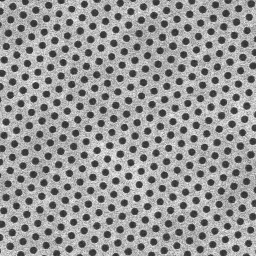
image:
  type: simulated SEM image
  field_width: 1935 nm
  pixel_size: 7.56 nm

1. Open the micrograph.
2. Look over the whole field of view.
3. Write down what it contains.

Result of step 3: a regular array of holes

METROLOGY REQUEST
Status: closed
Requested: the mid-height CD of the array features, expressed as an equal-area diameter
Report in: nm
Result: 51.9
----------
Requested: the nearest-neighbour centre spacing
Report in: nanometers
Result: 101